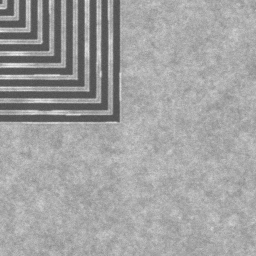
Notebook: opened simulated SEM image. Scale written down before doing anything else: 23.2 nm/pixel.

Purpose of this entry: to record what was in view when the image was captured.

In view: groups of lines, slits or small figures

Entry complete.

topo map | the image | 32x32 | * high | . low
*..............*****************
...............*****************
...............*****************
...*.....*.....*****************
.........*.....*****************
...............*****************
......*........*****************
...............*****************
...............*****************
...............*****************
...............*****************
...............*****************
**..........*..*****************
...............*****************
...............*****************
********************************
********************************
********************************
********************************
********************************
********************************
********************************
********************************
********************************
********************************
********************************
********************************
********************************
********************************
********************************
********************************
********************************